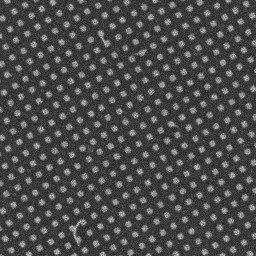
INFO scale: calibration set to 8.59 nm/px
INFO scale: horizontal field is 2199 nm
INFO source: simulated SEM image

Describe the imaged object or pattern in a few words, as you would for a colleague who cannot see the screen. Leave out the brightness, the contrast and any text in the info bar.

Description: a regular array of raised bodies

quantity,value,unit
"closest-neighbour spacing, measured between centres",105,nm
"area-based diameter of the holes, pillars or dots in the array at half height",53.1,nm